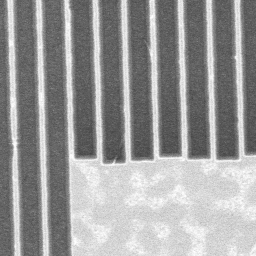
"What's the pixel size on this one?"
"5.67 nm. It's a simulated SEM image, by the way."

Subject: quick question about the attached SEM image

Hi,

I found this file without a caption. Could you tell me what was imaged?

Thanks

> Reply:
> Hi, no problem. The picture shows parallel lines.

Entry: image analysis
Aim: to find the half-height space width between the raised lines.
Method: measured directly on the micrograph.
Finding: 119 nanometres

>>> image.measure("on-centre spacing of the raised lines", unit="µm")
0.161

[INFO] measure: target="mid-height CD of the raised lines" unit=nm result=42.5